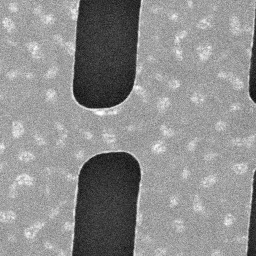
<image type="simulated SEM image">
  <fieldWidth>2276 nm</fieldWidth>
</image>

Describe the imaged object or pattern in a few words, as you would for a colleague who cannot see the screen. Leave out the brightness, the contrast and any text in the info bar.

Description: holes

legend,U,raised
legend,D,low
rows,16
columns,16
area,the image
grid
UUUUUDDDDUUUUUUU
UUUUUDDDDUUUUUUU
UUUUUDDDDUUUUUUU
UUUUUDDDDUUUUUUU
UUUUUDDDDUUUUUUU
UUUUUDDDUUUUUUUU
UUUUUDDUUUUUUUUU
UUUUUUUUUUUUUUUU
UUUUUUUUUUUUUUUU
UUUUUUUDUUUUUUUU
UUUUUDDDDUUUUUUU
UUUUUDDDDUUUUUUU
UUUUUDDDDUUUUUUU
UUUUUDDDDUUUUUUU
UUUUUDDDUUUUUUUU
UUUUUDDDUUUUUUUD